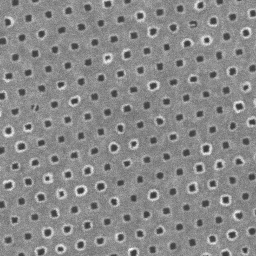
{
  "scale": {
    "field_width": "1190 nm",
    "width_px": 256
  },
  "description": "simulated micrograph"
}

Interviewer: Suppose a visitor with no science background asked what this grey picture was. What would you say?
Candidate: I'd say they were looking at a regular array of holes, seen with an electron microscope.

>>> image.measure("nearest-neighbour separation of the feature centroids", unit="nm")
92.4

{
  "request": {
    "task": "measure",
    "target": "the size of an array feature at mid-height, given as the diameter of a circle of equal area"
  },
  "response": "34 nanometers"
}